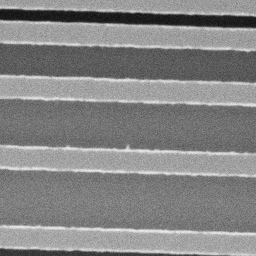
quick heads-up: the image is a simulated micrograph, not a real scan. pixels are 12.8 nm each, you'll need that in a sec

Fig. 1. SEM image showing lines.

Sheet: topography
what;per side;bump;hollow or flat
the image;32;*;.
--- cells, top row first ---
********************************
...............*****************
................................
****************************....
********************************
....****************************
................................
................................
................................
***.............................
********************************
********************************
..........**********************
................................
................................
................................
................................
................................
******..........................
********************************
********************************
............********************
................................
................................
................................
................................
................................
................................
*********.......................
********************************
********************************
.................***************